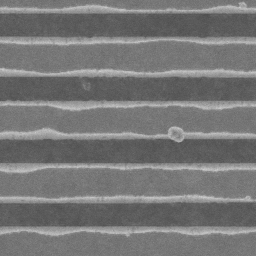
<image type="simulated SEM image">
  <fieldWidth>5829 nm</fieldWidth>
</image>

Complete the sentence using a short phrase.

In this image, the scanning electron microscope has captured lines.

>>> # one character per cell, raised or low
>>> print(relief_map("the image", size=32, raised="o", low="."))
oooooooooooooooooooooooooooooooo
................................
................................
................................
................................
oooooooooooooooooooooooooooooooo
oooooooooooooooooooooooooooooooo
oooooooooooooooooooooooooooooooo
oooooooooooooooooooooooooooooooo
................................
................................
................................
................................
oooooooooooooooooooooooooooooooo
oooooooooooooooooooooooooooooooo
oooooooooooooooooooooooooooooooo
oooooooooooooooooooooooooooooooo
......................o.........
................................
................................
................................
oooooooooooooooooooooooooooooooo
oooooooooooooooooooooooooooooooo
oooooooooooooooooooooooooooooooo
oooooooooooooooooooooooooooooooo
................................
................................
................................
................................
oooooooooooooooooooooooooooooooo
oooooooooooooooooooooooooooooooo
oooooooooooooooooooooooooooooooo